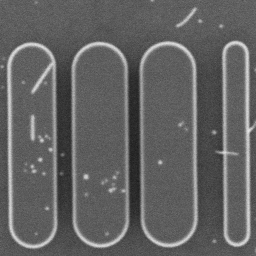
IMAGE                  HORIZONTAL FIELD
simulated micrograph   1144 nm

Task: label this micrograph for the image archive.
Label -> groups of lines, slits or small figures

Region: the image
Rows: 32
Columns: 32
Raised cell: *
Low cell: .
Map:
................................
................................
................................
................................
................................
...**......**.......**.......*..
..****....*****...******....***.
.******..*******..******....***.
.******..*******..******....***.
.******..*******..******....***.
.******..*******..******....***.
.******..*******..******....***.
.******..*******..******....***.
.******..*******..******....***.
.******..*******..******....***.
.******..*******..******....***.
.******..*******..******....***.
.******..*******..******....***.
.******..*******..******....***.
.******..*******..******....***.
.******..*******..******....***.
.******..*******..******....***.
.******..*******..******....***.
.******..*******..******....***.
.******..*******..******....***.
.******..*******..******....***.
.******..*******..******....***.
.******..*******..******....***.
.******..*******..******....***.
..*****...*****...******....***.
...***.....***......**.......*..
................................